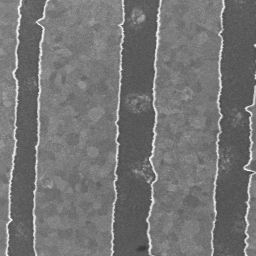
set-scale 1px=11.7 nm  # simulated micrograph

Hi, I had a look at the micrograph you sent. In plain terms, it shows one or a few lines or trenches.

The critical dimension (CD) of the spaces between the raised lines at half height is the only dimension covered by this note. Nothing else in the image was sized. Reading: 383 nanometres